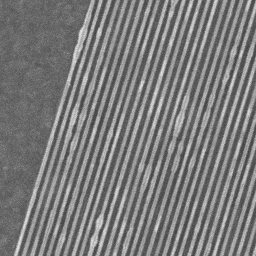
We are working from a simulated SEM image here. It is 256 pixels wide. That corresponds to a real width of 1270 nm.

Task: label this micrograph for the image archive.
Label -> parallel lines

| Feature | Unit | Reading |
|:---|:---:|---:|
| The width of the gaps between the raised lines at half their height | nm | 21.4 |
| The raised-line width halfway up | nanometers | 17.2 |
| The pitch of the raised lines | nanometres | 39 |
